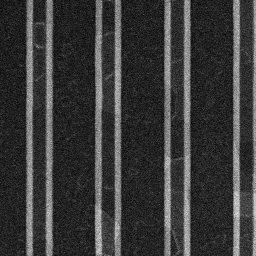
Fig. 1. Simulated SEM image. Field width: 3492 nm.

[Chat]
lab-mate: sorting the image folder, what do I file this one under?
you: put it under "one or a few lines or trenches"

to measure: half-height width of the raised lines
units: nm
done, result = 263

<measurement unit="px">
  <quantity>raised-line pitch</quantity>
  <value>69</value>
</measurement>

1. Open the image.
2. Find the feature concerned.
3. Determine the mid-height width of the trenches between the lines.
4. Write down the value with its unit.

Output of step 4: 680 nm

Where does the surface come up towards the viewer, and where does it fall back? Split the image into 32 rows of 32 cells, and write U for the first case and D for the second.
DDDDUUDDDDDDDUUDDDDDDUUDDDDDDDUU
DDDDUUDDDDDDUUUDDDDDDUUDDDDDDDUU
DDDDUUDDDDDDUUUDDDDDDUUDDDDDDDUU
DDDDUUDDDDDDUUUDDDDDDUUDDDDDDDUU
DDDDUUDDDDDDUUUDDDDDDUUDDDDDDDUU
DDDDUUDDDDDDUUUDDDDDDUUDDDDDDDUU
DDDDUUDDDDDDUUUDDDDDDUUDDDDDDDUU
DDDDUUDDDDDDUUUDDDDDDUUDDDDDDDUU
DDDDUUDDDDDDUUUDDDDDDUUDDDDDDDUU
DDDDUUDDDDDDUUUDDDDDDUUDDDDDDDUU
DDDDUUDDDDDDUUUDDDDDDUUDDDDDDDUU
DDDDUUDDDDDDUUUDDDDDDUUDDDDDDDUU
DDDDUUDDDDDDUUUDDDDDDUUDDDDDDDUU
DDDDUUDDDDDDUUUDDDDDDUUDDDDDDDUU
DDDDUUDDDDDDUUUDDDDDDUUDDDDDDDUU
DDDDUUDDDDDDUUUDDDDDDUUDDDDDDDUU
DDDDUUDDDDDDUUUDDDDDDUUDDDDDDDUU
DDDDUUDDDDDDUUUDDDDDDUUDDDDDDDUU
DDDDUUDDDDDDUUUDDDDDDUUDDDDDDDUU
DDDDUUDDDDDDUUUDDDDDDUUDDDDDDDUU
DDDDUUDDDDDDUUUDDDDDDUUDDDDDDDUU
DDDDUUDDDDDDUUUDDDDDDUUDDDDDDDUU
DDDDUUDDDDDDUUUDDDDDDUUDDDDDDDUU
DDDDUUDDDDDDUUUDDDDDDUUDDDDDDDUU
DDDDUUDDDDDDUUUDDDDDDUUDDDDDDDUU
DDDDUUDDDDDDUUUDDDDDDUUDDDDDDDUU
DDDDUUDDDDDDUUUDDDDDDUUDDDDDDDUU
DDDDUUDDDDDDUUUDDDDDDUUDDDDDDDUU
DDDDUUDDDDDDUUUDDDDDDUUDDDDDDDUU
DDDDUUDDDDDDUUUDDDDDDUUDDDDDDDUU
DDDDUUDDDDDDUUUDDDDDDUUDDDDDDDUU
DDDDUUDDDDDDUUUDDDDDDUUDDDDDDDUU